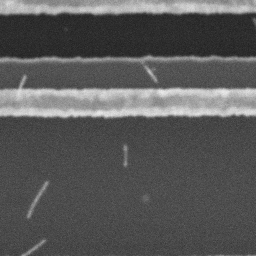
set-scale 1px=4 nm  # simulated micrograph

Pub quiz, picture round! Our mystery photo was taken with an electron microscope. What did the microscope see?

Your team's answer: lines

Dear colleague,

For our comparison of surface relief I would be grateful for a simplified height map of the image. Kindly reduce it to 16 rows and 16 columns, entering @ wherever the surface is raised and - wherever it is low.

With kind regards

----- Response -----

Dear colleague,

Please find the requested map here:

@@@@@@@@@@@@@@@@
----------------
----------------
----------------
@@@@@@@@@@@@@@@@
@@@@@@@@@@@@@@@@
@@@@@@@@@@@@@@@@
----------------
----------------
----------------
----------------
----------------
----------------
----------------
----------------
----------------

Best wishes